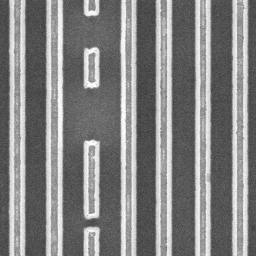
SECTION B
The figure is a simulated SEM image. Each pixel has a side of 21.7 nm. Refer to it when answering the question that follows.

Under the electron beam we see parallel lines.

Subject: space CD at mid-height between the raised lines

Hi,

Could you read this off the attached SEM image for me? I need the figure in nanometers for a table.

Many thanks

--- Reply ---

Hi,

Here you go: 579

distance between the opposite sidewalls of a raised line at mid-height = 215 nm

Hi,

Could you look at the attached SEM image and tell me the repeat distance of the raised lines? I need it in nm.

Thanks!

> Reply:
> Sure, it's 807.